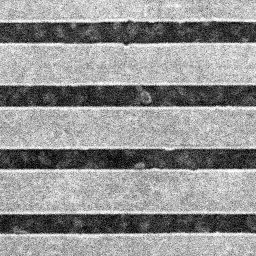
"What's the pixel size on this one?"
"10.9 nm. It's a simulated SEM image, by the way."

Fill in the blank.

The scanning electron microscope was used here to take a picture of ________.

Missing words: one or a few lines or trenches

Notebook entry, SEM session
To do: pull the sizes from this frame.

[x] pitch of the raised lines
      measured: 63.5 pixels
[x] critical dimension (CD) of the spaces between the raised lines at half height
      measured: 249 nm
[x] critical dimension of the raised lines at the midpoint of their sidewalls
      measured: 0.433 micrometres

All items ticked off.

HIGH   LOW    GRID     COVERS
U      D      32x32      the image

UUUUUUUUUUUUUUUUUUUUUUUUUUUUUUUU
UUUUUUUUUUUUUUUUUUUUUUUUUUUUUUUU
UUUUUUUUUUUUUUDDDDUUUUUUUUUDUUUU
DDDDDDDDDDDDDDDDDDDDDDDDDDDDDDDD
DDDDDDDDDDDDDDDDDDDDDDDDDDDDDDDD
DDDDDDDDDDDDDDDDDDDDDDDDDDDDDDDD
UUUUUUUUUUUUUUUUUUUUUUUUUUUUUUUU
UUUUUUUUUUUUUUUUUUUUUUUUUUUUUUUU
UUUUUUUUUUUUUUUUUUUUUUUUUUUUUUUU
UUUUUUUUUUUUUUUUUUUUUUUUUUUUUUUU
UUUUUUUUUUUUDDDDDDDDDDDDDDDDDDDD
DDDDDDDDDDDDDDDDDDDDDDDDDDDDDDDD
DDDDDDDDDDDDDDDDDDDDDDDDDDDDDDDD
DDDDUDDDDDDDDDDDDDDDDDDDDDUUUUUD
UUUUUUUUUUUUUUUUUUUUUUUUUUUUUUUU
UUUUUUUUUUUUUUUUUUUUUUUUUUUUUUUU
UUUUUUUUUUUUUUUUUUUUUUUUUUUUUUUU
UUUUUUUUUUUUUUUUUUUUUUUUUUUUUUUU
DDDDDDDDDDUDDDDDUUDDUUDDDDDDDDDD
DDDDDDDDDDDDDDDDDDDDDDDDDDDDDDDD
DDDDDDDDDDDDDDDDDDDDDDDDDDDDDDDD
UUUUUUUUUUUUUUUUUUUUUUUUUUUUUUUU
UUUUUUUUUUUUUUUUUUUUUUUUUUUUUUUU
UUUUUUUUUUUUUUUUUUUUUUUUUUUUUUUU
UUUUUUUUUUUUUUUUUUUUUUUUUUUUUUUU
UUUUUUUUUUUUUUUUUUUUUUUUUUUUUUUU
UUUUUUUUUUUUDDDDDDDDDDDDDDDDDDUU
DDDDDDDDDDDDDDDDDDDDDDDDDDDDDDDD
DDDDDDDDDDDDDDDDDDDDDDDDDDDDDDDD
UUUUUUUUUUUUUUUUUUUUUUUUUUUUUUUU
UUUUUUUUUUUUUUUUUUUUUUUUUUUUUUUU
UUUUUUUUUUUUUUUUUUUUUUUUUUUUUUUU